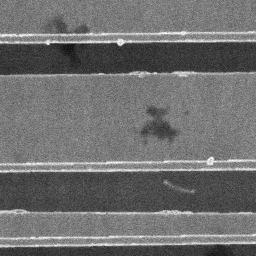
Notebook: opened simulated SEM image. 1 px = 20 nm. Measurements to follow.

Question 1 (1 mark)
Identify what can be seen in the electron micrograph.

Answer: lines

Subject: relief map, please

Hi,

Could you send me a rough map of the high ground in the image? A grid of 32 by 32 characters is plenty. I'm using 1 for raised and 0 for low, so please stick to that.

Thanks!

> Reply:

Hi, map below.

11111111111111111111111111111111
11111111111111111111111111111111
11111111111111111111111111111111
11111111111111111111111111111111
11111111111111111111111111111111
00000000000000000000000000000000
00000000000000000000000000000000
00000000000000000000000000000000
00000000000000000000000000000000
11111111111111111111111111111111
11111111111111111111111111111111
11111111111111111111111111111111
11111111111111111111111111111111
11111111111111111111111111111111
11111111111111111111111111111111
11111111111111111111111111111111
11111111111111111111111111111111
11111111111111111111111111111111
11111111111111111111111111111111
11111111111111111111111111111111
11111111111111111111111111111111
00000000000000000000000000000000
00000000000000000000000000000000
00000000000000000000000000000000
00000000000000000000000000000000
00000000000000000000000000000000
11110000000000000000111100000000
11111111111111111111111111111111
11111111111111111111111111111111
11111111111111111111111111111111
11111111111111111111111100000000
00000000000000000000000000000000